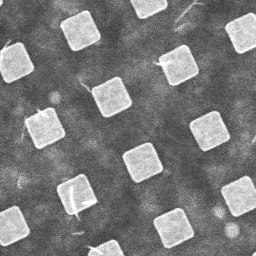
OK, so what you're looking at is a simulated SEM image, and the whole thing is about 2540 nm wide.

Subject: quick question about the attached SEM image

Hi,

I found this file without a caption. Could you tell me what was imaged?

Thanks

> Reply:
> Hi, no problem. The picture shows a regular array of raised bodies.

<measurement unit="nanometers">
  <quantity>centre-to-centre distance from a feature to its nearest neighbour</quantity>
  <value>720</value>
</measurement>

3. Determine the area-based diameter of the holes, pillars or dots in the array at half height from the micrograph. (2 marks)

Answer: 352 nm